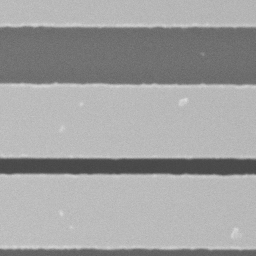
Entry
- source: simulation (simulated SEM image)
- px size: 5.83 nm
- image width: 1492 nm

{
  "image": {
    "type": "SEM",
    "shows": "lines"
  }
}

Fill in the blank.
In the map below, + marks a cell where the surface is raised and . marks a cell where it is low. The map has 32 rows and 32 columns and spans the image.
++++++++++++++++++++++++++++++++
++++++++++++++++++++++++++++++++
++++++++++++++++++++++++++++++++
................................
................................
................................
................................
................................
................................
................................
................................
++++++++++++++++++++++++++++++++
++++++++++++++++++++++++++++++++
++++++++++++++++++++++++++++++++
++++++++++++++++++++++++++++++++
++++++++++++++++++++++++++++++++
++++++++++++++++++++++++++++++++
++++++++++++++++++++++++++++++++
++++++++++++++++++++++++++++++++
++++++++++++++++++++++++++++++++
................................
................................
++++++++++++++++++++++++++++++++
++++++++++++++++++++++++++++++++
++++++++++++++++++++++++++++++++
++++++++++++++++++++++++++++++++
++++++++++++++++++++++++++++++++
++++++++++++++++++++++++++++++++
++++++++++++++++++++++++++++++++
++++++++++++++++++++++++++++++++
++++++++++++++++++++++++++++++++
................................